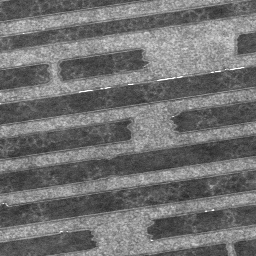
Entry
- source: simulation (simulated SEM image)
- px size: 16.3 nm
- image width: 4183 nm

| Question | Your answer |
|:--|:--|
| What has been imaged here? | parallel lines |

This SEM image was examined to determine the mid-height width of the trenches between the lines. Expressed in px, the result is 13.2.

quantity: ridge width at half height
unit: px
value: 20.4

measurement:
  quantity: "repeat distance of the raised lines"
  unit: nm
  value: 560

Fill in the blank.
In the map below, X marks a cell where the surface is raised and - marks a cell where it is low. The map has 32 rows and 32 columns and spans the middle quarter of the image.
XXXXXXXXXXXXXXXXXXXX------------
XXXXXXXXXXXXXXXXXXX-------------
XXXXXXXXXXXX--------------------
XXXXX-----------------------XXXX
----------------------XXXXXXXXXX
---------------XXXXXXXXXXXXXXXXX
--------XXXXXXXXXXXXXXXXXXXXXXXX
--XXXXXXXXXXXXXXXXXX-XXXXXXXXXXX
XXXXXXXXXXXXXXXXXXXXXXXXXXXXX---
XXXXXXXXXXXXXXXXXXXXXX----------
XXXXXXXXXXXXXXX-----------------
XXXXXXXX------------------------
XX---------------------------XXX
---------------------------XXXXX
-------------XXXX----------XXXXX
------XXXXXXXXXX------------XXXX
XXXXXXXXXXXXXXXX-----------XXXXX
XXXXXXXXXXXXXXXXX---------------
XXXXXXXXXXXXXXXXX---------------
XXXXXXXXXXXXX-------------------
XXXXXX-------------------------X
------------------------XXXXXXXX
-----------------XXXXXXXXXXXXXXX
------------XXXXXXXXXXXXXXXXXXXX
----XXXXXXXXXXXXXXXXXXXXXXXXXXXX
XXXXXXXXXXXXXXXXXXXXXXXXXXXXXXX-
XXXXXXXXXXXXXXXXXXXXXXXX--------
XXXXXXXXXXXXXXXXX---------------
XXXXXX-XX-----------------------
XXXX-----------------------XXXXX
--------------------XXXXXXXXXXXX
---------------XXXXXXXXXXXXXXXXX